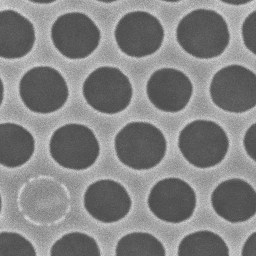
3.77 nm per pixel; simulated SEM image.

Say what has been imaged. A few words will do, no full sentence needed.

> a regular array of holes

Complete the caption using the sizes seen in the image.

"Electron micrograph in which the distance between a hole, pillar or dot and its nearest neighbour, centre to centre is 238 nm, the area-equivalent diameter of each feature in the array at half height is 184 nanometres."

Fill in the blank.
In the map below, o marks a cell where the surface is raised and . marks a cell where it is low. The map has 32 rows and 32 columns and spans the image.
ooooooooooooooooooooooooooooo..o
..ooooooo.oooooo..oooooo...ooooo
....ooo.....ooo.....ooo.....ooo.
....oo......oo......oo.......o..
....oo.......o.......o.......o..
....ooo.....ooo.....oo.......oo.
....ooo.....ooo....oooo.....ooo.
oooooooooooooooooooooooooooooooo
oooo...ooooo...ooooo..oooooo...o
ooo.....ooo.....ooo....oooo.....
oo......oo......oo......oo......
oo.......o.......o......oo......
ooo.....ooo.....ooo.....ooo.....
ooo.....oooo....oooo...oooo.....
oooooooooooooooooooooooooooooooo
..ooooooo.oooooo...oooo....ooooo
....ooo.....ooo.....ooo.....ooo.
....oo......oo.......o.......o..
....oo......oo.......o.......oo.
....oo......ooo......oo.....ooo.
...oooo.....ooo.....oooo...ooooo
oooooooooooooooooooooooooooooooo
oooooooooooo..oooooo...ooooo..oo
ooooooooooo.....ooo.....ooo.....
oooooooooo......ooo.....oo......
oooooooooo......oo......oo......
ooooooooooo.....ooo.....ooo.....
oooooooooooo...ooooo...ooooo...o
oooooooooooooooooooooooooooooooo
...ooooo...oooo....oooo....oooo.
....ooo.....ooo.....oo......oo..
.....o.......o.......o.......o..